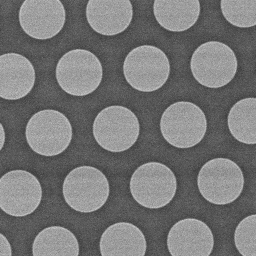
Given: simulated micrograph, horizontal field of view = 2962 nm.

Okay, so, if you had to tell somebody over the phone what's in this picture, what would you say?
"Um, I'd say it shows an array of small figures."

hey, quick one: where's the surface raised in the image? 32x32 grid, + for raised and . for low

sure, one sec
...+++++...+++++...++++++...++++
..++++++...+++++...++++++...++++
..++++++...+++++....+++++...++++
...+++++....++++.....+++........
....+++.........................
..........................++....
.........++.....++++....+++++...
+++.....++++....+++++...++++++..
++++...++++++...+++++...++++++..
++++...++++++...+++++...+++++...
++++...+++++....++++.....+++....
++++....+++.....................
..............................++
.............+++.....++++....+++
....++++....+++++...++++++...+++
...++++++...+++++...++++++...+++
...++++++...+++++...++++++...+++
...++++++...+++++....++++.....++
....++++.....+++................
................................
..................++......+++...
.++......++++....++++....+++++..
+++++...+++++...++++++...+++++..
+++++...++++++..++++++...+++++..
+++++...+++++....+++++...+++++..
+++++....++++.....+++...........
.+++............................
.......................++.....++
......++......+++.....++++....++
.....++++....+++++...++++++..+++
+...++++++...+++++...++++++..+++
+...++++++...+++++...+++++....++